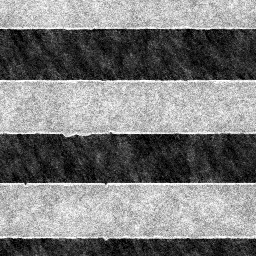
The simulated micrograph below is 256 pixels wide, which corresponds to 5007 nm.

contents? one or a few lines or trenches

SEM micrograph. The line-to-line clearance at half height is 996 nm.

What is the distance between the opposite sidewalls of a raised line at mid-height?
1.06 µm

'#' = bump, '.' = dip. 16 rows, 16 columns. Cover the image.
################
################
................
................
................
################
################
################
................
................
................
....#..#........
################
################
################
................